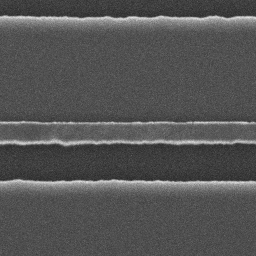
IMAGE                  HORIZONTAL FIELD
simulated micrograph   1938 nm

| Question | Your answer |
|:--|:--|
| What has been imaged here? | lines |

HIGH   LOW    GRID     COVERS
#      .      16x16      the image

................
################
################
################
################
################
################
################
################
................
................
################
################
################
################
################